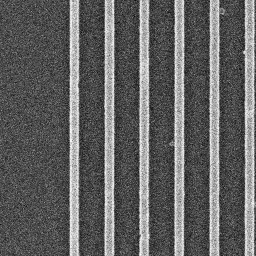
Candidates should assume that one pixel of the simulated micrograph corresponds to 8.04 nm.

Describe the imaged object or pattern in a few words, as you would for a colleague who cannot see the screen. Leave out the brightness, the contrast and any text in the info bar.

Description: parallel lines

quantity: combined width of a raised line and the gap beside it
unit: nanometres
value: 282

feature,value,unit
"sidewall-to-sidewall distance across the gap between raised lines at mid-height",216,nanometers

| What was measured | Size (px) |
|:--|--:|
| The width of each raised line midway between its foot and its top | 7.75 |